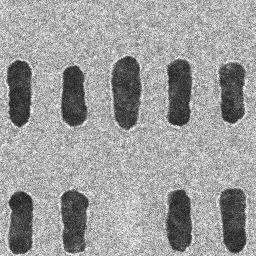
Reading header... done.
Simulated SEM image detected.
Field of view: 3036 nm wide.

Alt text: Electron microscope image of a regular array of holes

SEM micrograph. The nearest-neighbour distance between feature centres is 630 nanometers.